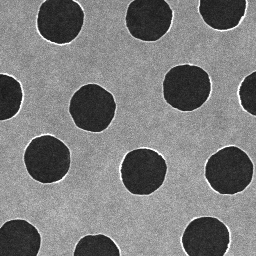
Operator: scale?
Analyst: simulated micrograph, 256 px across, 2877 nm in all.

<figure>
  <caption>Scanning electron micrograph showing holes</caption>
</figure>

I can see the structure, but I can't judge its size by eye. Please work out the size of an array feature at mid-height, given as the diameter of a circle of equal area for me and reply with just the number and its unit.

532 nm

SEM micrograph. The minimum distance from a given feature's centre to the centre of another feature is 911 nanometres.